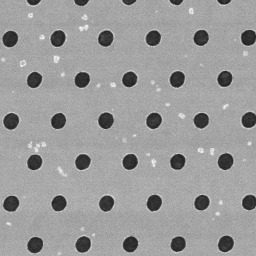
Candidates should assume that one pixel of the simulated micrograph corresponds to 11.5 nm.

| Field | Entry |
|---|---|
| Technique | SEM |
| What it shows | a regular array of holes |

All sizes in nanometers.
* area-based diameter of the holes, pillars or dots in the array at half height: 188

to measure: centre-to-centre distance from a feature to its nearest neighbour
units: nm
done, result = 546